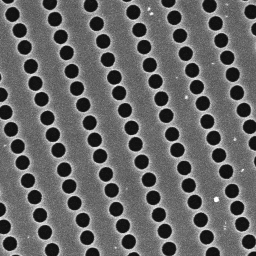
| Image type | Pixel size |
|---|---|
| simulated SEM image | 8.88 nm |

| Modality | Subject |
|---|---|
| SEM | a regular array of holes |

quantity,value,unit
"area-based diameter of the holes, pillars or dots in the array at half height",130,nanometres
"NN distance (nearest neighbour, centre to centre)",157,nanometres